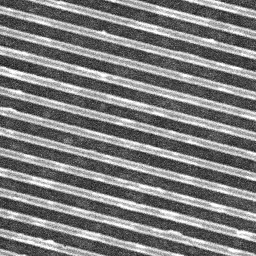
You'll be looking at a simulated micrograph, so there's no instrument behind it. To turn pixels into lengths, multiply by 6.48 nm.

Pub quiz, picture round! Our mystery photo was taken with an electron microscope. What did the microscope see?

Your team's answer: parallel lines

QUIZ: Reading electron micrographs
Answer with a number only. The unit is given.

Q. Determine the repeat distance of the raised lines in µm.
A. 0.127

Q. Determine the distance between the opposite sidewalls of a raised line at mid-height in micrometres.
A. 0.0384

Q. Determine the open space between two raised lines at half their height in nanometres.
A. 89.3